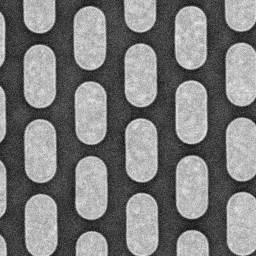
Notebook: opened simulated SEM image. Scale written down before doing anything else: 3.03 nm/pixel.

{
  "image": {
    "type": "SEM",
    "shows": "groups of lines, slits or small figures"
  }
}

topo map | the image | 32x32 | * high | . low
...****.........***.........****
...****...***...***...***...****
...****..****...***...****..****
*...**...****...***...****...**.
*........****.........****......
*........****.........****....*.
*..****..****...***...****..****
...****..****...****..****..****
...****...**....****...**...****
...****.........****........****
...****...**....****...**...****
...****...***...****..****..****
*..****..****...***...****...***
*........****.........****......
*.........***.........****......
*...**....***...***...****...***
*..****...***...****..****..****
...****...***...****...**...****
...****.........****........****
...****.........****........****
...****...***...****..****..****
*..****...***...****..****...***
*...**....***....**...****....*.
*.........***.........****......
*...**....***....**...****...***
*..****...***...****..****..****
*..****...***...****..****..****
...****.........****........****
...****.........****........****
...****...***...****...**...****
*..****...***...****..****..****
*...***...***...***...****...***